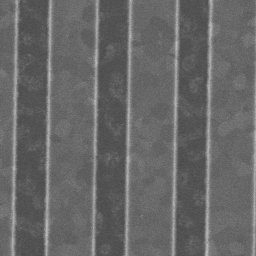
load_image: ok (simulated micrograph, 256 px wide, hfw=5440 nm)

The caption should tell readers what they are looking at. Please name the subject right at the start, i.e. one or a few lines or trenches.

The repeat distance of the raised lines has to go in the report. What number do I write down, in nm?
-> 1700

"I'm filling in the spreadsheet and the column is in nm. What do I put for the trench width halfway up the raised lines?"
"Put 714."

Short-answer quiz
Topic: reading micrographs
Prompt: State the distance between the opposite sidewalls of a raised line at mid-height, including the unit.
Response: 999 nm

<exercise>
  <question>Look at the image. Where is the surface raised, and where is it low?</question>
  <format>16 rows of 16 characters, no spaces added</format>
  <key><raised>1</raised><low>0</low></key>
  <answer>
1001110011100111
1001110011100111
1001110011100111
1001110011100111
1001110011100111
1001110011100111
1001110011100111
1001110011100111
1001110011100111
1001110011100111
1001110011100111
1001110011100111
1001110011100111
1001110011100111
1001110011100111
1001110011100111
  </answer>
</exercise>